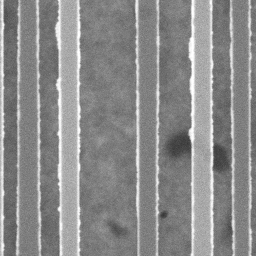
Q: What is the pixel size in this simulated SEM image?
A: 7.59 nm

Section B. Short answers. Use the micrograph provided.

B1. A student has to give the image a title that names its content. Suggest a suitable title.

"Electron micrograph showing lines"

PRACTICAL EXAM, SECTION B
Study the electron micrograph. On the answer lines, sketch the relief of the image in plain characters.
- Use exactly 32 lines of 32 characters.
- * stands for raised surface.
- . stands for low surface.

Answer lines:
..***..***.......***....**...**.
..***..***.......***....**...**.
..***..***.......***....**...**.
..***..***.......***....**...**.
..***..***.......***....**...**.
..***..***.......***....***..**.
..***..***.......***....**...**.
..***..***.......***....***..**.
..***..***.......***....***..**.
..***..***.......***....***..**.
..***..***.......***....***..**.
..***..***.......***....***..**.
..***..***.......***....***..**.
..***..***.......***....***..**.
..***..***.......***....***..**.
..***..***.......***....***..**.
..***..***.......***....***..**.
..***...**.......***....***..**.
..***..***.......***....***..**.
..***...**.......***....***..**.
..***..***.......***....***..**.
..***...**.......***....***..**.
..***...**.......***....***..**.
..***...**.......***....***..**.
..***...**.......***....***..**.
..***...**.......***....***..**.
..***...**.......***....***..**.
..***...**.......***....***..**.
..***...**.......***....***..**.
..***...**.......***....***..**.
..***...**.......***....***..**.
..***...**.......***....***..**.